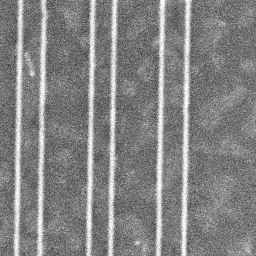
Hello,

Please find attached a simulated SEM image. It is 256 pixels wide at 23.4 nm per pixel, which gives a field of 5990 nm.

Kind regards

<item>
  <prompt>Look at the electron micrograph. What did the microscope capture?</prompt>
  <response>one or a few lines or trenches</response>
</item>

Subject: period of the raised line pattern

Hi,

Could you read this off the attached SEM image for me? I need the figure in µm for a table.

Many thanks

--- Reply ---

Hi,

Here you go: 1.67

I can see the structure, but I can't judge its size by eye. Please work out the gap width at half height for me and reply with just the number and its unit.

1.14 um